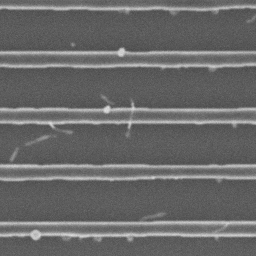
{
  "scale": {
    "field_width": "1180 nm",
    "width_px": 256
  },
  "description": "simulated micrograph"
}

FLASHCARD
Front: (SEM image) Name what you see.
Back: lines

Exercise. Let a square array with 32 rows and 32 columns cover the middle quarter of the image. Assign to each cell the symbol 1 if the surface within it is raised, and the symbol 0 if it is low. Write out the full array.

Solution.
11111111111111111100111111111111
00000000000000000000000000000000
00000000000000000000000000000000
00000000000000000000000000000000
00000000000000000000000000000000
00000000000000000000000000000000
00000000000000000000000000000000
00000000000000000000000000000000
00000000000000000000000000000000
00000000000000000000000000000000
00000000000000000000000000000000
11111111111111111111111111111111
11111111111111111111111111111111
11111111111111111111111111111111
11111011111111111111111110111111
00000000000000000000000000000000
00000000000000000000000000000000
00000000000000000000000000000000
00000000000000000000000000000000
00000000000000000000000000000000
00000000000000000000000000000000
00000000000000000000000000000000
00000000000000000000000000000000
00000000000000000000000000000000
00000000000000000000000000000000
01100000000000000000000000000000
11111111111111111111111111111111
11111111111111111111111111111111
11111111111111111111111000000000
00000000000000000000000000000000
00000000000000000000000000000000
00000000000000000000000000000000